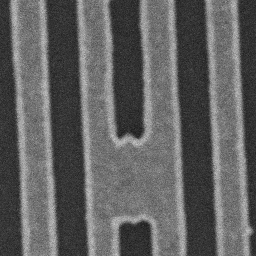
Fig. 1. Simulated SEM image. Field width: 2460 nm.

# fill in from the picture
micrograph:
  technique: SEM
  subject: one or a few lines or trenches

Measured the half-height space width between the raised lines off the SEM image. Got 36.7 px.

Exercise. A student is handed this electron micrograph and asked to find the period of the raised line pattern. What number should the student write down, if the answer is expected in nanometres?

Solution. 619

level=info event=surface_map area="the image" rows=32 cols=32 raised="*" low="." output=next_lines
..***.....***.....***.....***...
..***.....***.....***.....***...
..***.....***.....***.....***...
..***.....****....***.....***...
..***.....****....****....****..
..****....****....****....****..
..****....****....****....****..
..****....****....****....****..
..****....****....****.....***..
..****....****....****.....***..
..****....****....****.....***..
..****....****....****.....***..
..****.....***....****.....***..
..****.....***....****.....***..
...***.....***....****.....***..
...***.....***....****.....***..
...***.....***....****.....***..
...***.....******.****.....***..
...***.....***********.....***..
...***.....***********.....***..
...***.....***********.....***..
...***.....***********.....***..
...***.....***********.....***..
...***.....***********.....***..
...***.....***********.....***..
...***.....************....***..
...***.....************....****.
...****....****.*..****....****.
...****....***.....****....****.
...****....***.....****....****.
...****....****....****.....***.
...****....****....****.....***.